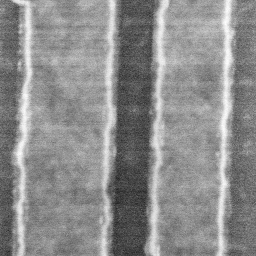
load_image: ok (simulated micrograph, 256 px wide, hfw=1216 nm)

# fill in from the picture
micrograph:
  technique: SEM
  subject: one or a few lines or trenches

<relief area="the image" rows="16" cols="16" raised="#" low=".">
..#####...####..
..#####...####..
..#####...####..
..#####...####..
..#####...####..
..#####...####..
..#####...####..
..#####...####..
..#####...####..
.######...####..
.######...####..
.######...####..
.######...####..
.######...####..
.######...####..
.######...####..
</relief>